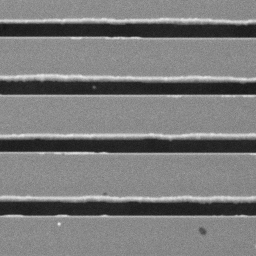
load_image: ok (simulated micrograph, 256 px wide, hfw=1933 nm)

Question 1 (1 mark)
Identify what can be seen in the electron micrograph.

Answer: lines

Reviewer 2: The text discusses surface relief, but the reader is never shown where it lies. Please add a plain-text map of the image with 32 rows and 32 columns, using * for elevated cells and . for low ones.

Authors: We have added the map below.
********************************
********************************
********************************
................................
................................
********************************
********************************
********************************
********************************
********************************
................................
................................
********************************
********************************
********************************
********************************
********************************
................................
................................
********************************
********************************
********************************
********************************
********************************
********************************
................................
................................
********************************
********************************
********************************
********************************
********************************